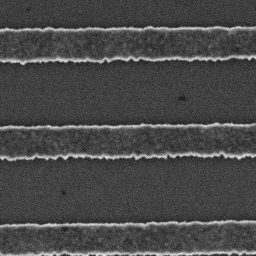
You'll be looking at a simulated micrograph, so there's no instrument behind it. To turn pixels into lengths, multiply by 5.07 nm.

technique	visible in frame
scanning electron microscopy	lines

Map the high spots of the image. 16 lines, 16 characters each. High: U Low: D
DDDDDDDDDDDDDDDD
DDDDDDDDDDDDDDDD
UUUUUUUUUUUUUUUU
UUUUUUUUUUUUUUUU
DDDDDDDDDDDDDDDD
DDDDDDDDDDDDDDDD
DDDDDDDDDDDDDDDD
DDDDDDDDDDDDDDDD
UUUUUUUUUUUUUUUU
UUUUUUUUUUUUUUUU
DDDDDDDDDDDDDDDD
DDDDDDDDDDDDDDDD
DDDDDDDDDDDDDDDD
DDDDDDDDDDDDDDDD
UUUUUUUUUUUUUUUU
UUUUUUUUUUUUUUUU